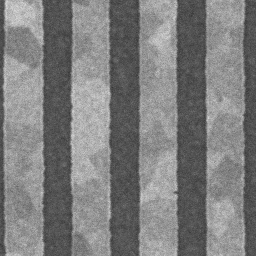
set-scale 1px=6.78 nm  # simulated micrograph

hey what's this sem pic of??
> one or a few lines or trenches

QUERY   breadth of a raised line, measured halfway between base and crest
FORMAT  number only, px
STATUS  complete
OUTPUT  36.5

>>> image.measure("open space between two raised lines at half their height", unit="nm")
212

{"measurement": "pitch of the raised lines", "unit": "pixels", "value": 67.1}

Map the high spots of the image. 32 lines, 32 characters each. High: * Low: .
.****....****.....****....****..
.****....****.....****....****..
.****....*****....****....****..
.****....*****....****....****..
.****....*****....****....****..
.****....*****....****....****..
.****....*****....****....****..
.****....*****....****....****..
.****....*****....****....****..
.****....*****....****....****..
.****....*****....****....****..
.****....*****....****....****..
.****....*****....****....****..
.****....*****....****....****..
.****....*****....****....****..
.****....*****....****....****..
.****....*****....****....****..
.****....*****....****....****..
.****....*****....****....****..
.****....*****....****....****..
.****....*****...*****....****..
.****....*****...*****....****..
.****....*****....****....****..
.****....*****....****....****..
.****....*****....****....****..
.****....*****....****....****..
.****....*****....****....****..
.****....*****....****....****..
.****....*****....****....****..
.****....*****...*****....****..
.****....*****....****....****..
.****....*****...*****....*****.